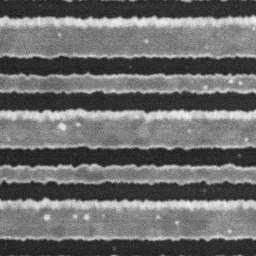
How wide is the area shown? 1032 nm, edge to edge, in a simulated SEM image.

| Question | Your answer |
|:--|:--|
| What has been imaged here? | lines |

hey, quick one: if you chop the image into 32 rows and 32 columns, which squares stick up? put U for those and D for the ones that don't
DDDDDDDDDDDDDDDDDDDDDDDDDDDDDDDD
DDDDDDDDDDDDDDDDDDDDDDDDDDDDDDDD
UDDDUUUDUDDDDDDDDDDUDDDDDDUDUUUU
UUUUUUUUUUUUUUUUUUUUUUUUUUUUUUUU
UUUUUUUUUUUUUUUUUUUUUUUUUUUUUUUU
UUUUUUUUUUUUUUUUUUUUUUUUUUUUUUUU
UUUUUUUUUUUUUUUUUUUUUUUUUUUUUUUU
DDDDDDDDDDDDDDDDDDDDDDDDDDDDDDDD
DDDDDDDDDDDDDDDDDDDDDDDDDDDDDDDD
UUUUUDUUDUUUUUUUUDDUUDUUUUDUUUUU
UUUUUUUUUUUUUUUUUUUUUUUUUUUUUUUU
DDUDUUDUUDUUDUUUDDUUUUDDUUUDDDUU
DDDDDDDDDDDDDDDDDDDDDDDDDDDDDDDD
DDDDDDDDDDDDDDDDDDDDDDDDDDDDDDDD
UUUUUUUUUUUUUUUUUUUUUUUUUUUUUUUU
UUUUUUUUUUUUUUUUUUUUUUUUUUUUUUUU
UUUUUUUUUUUUUUUUUUUUUUUUUUUUUUUU
UUUUUUUUUUUUUUUUUUUUUUUUUUUUUUUU
DDDUUDDDDDDDDDDDDDUDDUDUDDDDDDDD
DDDDDDDDDDDDDDDDDDDDDDDDDDDDDDDD
DDDDDDDDDDDDDDDDDDDDDDDDDDDDDDDD
UUUUUUUUUUUUUUUUUUUUUUUUUUUUUUUU
UUUUUUUUUUUUUUUUUUUUUUUUUUUUUUUU
DDDDDDDDDDDDDDDDDDDDDDDDDDDDDDDD
DDDDDDDDDDDDDDDDDDDDDDDDDDDDDDDD
UUUUUUUUUUUUUUUUUUUUUUUUUUUUUUUU
UUUUUUUUUUUUUUUUUUUUUUUUUUUUUUUU
UUUUUUUUUUUUUUUUUUUUUUUUUUUUUUUU
UUUUUUUUUUUUUUUUUUUUUUUUUUUUUUUU
UUUUUUUUUUUUUUUUUUUUUUUUUUUUUUUU
DDDDDDDDDDDDDDDDDDDDDDDDDDDDDDDD
DDDDDDDDDDDDDDDDDDDDDDDDDDDDDDDD